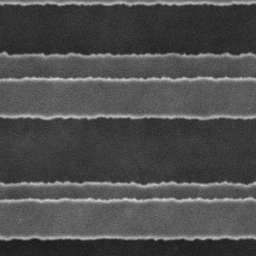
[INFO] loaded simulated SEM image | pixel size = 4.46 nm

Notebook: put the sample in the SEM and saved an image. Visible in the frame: lines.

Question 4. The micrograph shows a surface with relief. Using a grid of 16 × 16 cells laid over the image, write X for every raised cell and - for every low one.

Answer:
----------------
----------------
----------------
XXXXXXXXXXXXXXXX
XXXXXXXXXXXXXXXX
XXXXXXXXXXXXXXXX
XXXXXXXXXXXXXXXX
----------------
----------------
----------------
----------------
XXXXXXXXX-XX-XX-
XXXXXXXXXXXXXXXX
XXXXXXXXXXXXXXXX
XXXXXXXXXXXXXXXX
----------------